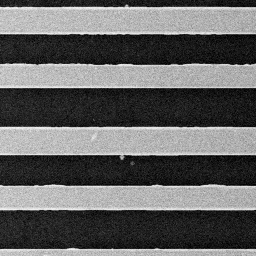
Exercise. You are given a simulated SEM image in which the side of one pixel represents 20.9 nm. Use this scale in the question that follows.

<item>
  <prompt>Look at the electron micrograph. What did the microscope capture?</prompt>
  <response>lines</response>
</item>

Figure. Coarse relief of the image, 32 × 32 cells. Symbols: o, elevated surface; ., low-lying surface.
................................
oooooooooooooooooooooooooooooooo
oooooooooooooooooooooooooooooooo
oooooooooooooooooooooooooooooooo
................................
................................
................................
................................
oooooooooooooooooooooooooooooooo
oooooooooooooooooooooooooooooooo
oooooooooooooooooooooooooooooooo
................................
................................
................................
................................
................................
oooooooooooooooooooooooooooooooo
oooooooooooooooooooooooooooooooo
oooooooooooooooooooooooooooooooo
................................
................................
................................
................................
oooooooooooooooooooooooooooooooo
oooooooooooooooooooooooooooooooo
oooooooooooooooooooooooooooooooo
................................
................................
................................
................................
................................
oooooooooooooooooooooooooooooooo